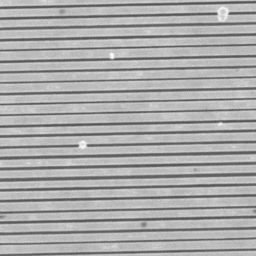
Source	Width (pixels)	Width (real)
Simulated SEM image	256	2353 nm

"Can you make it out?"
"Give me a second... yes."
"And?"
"parallel lines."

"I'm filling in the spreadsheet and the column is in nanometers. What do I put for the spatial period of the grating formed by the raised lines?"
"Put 98.7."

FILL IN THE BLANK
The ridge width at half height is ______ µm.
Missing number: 0.0724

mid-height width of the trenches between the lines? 27.6 nm